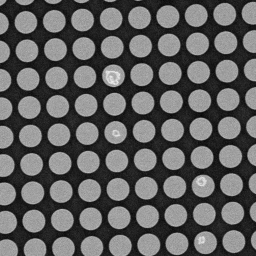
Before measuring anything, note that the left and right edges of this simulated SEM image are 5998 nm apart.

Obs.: an array of small figures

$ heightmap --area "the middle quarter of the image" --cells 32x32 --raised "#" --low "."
...........###....###...#####..#
...####...#####..#####..#####..#
#..#####..#####..#####..#####..#
#..#####..#####..#####..#####..#
#..#####..#####..#####...###....
....###....##...................
................................
............##....###....####...
...#####..#####..#####..#####..#
#..#####..#####..#####..######.#
#..#####..#####..#####..#####..#
#..#####..#####...####...####...
....###....###.....#............
................................
............##.....##....####...
....####...####...####...#####..
#..#####..######.######.######..
#..#####..######.######..#####..
#..#####...####...####...####...
#...####...###......#...........
................................
...................##.....###...
....####...####...#####..#####..
#...#####..#####..#####..#####..
##.######..#####..#####..#####..
##.######..#####..#####..####...
#...####....###....##...........
................................
....................##....###...
#....###...#####..#####..#####..
##..#####..#####..#####..#####..
##..#####..#####..#####..#####..